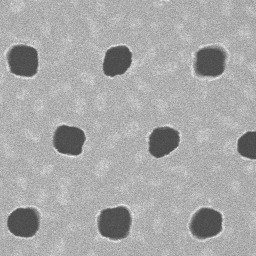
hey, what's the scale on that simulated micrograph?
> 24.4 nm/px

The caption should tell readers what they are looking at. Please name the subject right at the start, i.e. a regular array of holes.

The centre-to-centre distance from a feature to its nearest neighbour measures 91.7 pixels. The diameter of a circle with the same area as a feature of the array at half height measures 752 nm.